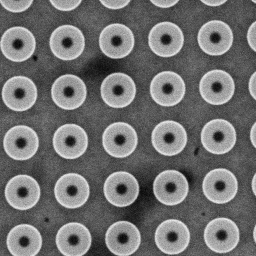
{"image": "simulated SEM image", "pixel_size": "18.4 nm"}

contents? an array of small figures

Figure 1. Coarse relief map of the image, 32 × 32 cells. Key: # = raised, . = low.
####...###...###...###....##....
................................
................................
..#....###...###...###...####..#
####..####...####..####..####..#
####..####..#####..####..####..#
####...###...###...###....##....
.##.............................
................................
........#.....##....##....###...
.###...####..####..####..####..#
#####.#####..####..####..####..#
####...###...####..####...###...
.###....#.......................
................................
..............##....##....###...
.###...####..####..####..####..#
.####..####..####..####..####..#
.####..####..####..####...###...
.###....##....##................
................................
....................##....###...
.###...####..####..####..#####..
.####..####..####..####..#####..
.####..####..####..####...###...
.###....##....##.....#..........
................................
.....................#.....##...
..##....###...###...###...####..
.####..####..####..#####..####..
.####..####..####...###...####..
.####...###...###...###....#....